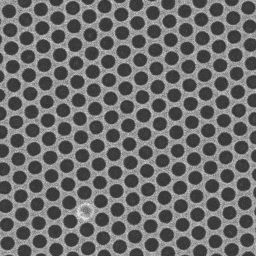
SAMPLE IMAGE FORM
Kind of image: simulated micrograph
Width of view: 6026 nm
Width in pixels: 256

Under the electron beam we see a regular array of holes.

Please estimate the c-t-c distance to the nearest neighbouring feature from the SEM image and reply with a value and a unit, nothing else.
429 nanometres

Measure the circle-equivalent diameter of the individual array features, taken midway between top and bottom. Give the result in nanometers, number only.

338